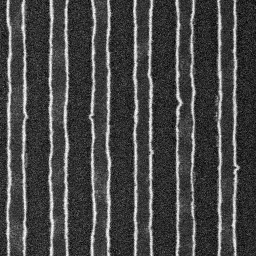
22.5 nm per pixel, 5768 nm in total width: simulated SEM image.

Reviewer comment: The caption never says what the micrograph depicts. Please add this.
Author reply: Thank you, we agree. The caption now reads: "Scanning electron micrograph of parallel lines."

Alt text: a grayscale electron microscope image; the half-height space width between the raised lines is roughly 0.608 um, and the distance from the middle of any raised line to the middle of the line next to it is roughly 42.1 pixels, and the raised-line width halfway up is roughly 0.344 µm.